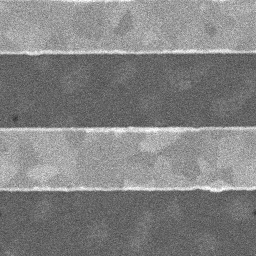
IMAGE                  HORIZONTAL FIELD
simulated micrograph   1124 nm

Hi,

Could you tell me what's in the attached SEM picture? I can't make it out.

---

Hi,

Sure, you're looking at one or a few lines or trenches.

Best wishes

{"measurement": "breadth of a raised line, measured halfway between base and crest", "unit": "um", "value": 0.266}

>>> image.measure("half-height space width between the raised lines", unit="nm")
334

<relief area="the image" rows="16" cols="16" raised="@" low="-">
@@@@@@@@@@@@@@@@
@@@@@@@@@@@@@@@@
@@@@@@@@@@@@@@@@
----------------
----------------
----------------
----------------
----------------
@@@@@@@@@@@@@@@@
@@@@@@@@@@@@@@@@
@@@@@@@@@@@@@@@@
@@@@@@@@@@@@@@@@
----------------
----------------
----------------
----------------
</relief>